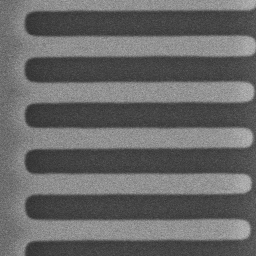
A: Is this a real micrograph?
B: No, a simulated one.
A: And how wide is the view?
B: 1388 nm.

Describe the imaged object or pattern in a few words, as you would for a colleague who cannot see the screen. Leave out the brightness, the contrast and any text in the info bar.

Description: groups of lines, slits or small figures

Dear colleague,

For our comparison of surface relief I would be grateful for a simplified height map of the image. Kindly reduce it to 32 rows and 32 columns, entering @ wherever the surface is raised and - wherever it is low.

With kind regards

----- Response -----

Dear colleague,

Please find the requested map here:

@@@@@@@@@@@@@@@@@@@@@@@@@@@@@@@@
@@@@----------------------------
@@@-----------------------------
@@@-----------------------------
@@@@@---------------------------
@@@@@@@@@@@@@@@@@@@@@@@@@@@@@@@@
@@@@@@@@@@@@@@@@@@@@@@@@@@@@@@@@
@@@@----------------------------
@@@-----------------------------
@@@-----------------------------
@@@@@@@@@@@@@@@@@@@@@@@@@@@@@@@-
@@@@@@@@@@@@@@@@@@@@@@@@@@@@@@@@
@@@@@@@@@@@@@@@@@@@@@@@@@@@@@@@-
@@@-----------------------------
@@@-----------------------------
@@@-----------------------------
@@@@@@@@@@@@@@@@@@@@@@@@@@@@@@@-
@@@@@@@@@@@@@@@@@@@@@@@@@@@@@@@@
@@@@@@@@@@@@@@@-----------------
@@@-----------------------------
@@@-----------------------------
@@@@----------------------------
@@@@@@@@@@@@@@@@@@@@@@@@@@@@@@@-
@@@@@@@@@@@@@@@@@@@@@@@@@@@@@@@-
@@@@----------------------------
@@@-----------------------------
@@@-----------------------------
@@@@----------------------------
@@@@@@@@@@@@@@@@@@@@@@@@@@@@@@@-
@@@@@@@@@@@@@@@@@@@@@@@@@@@@@@@-
@@@@----------------------------
@@@-----------------------------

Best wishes